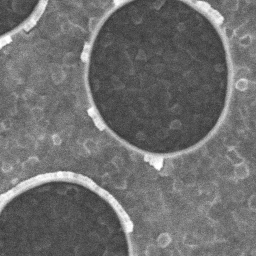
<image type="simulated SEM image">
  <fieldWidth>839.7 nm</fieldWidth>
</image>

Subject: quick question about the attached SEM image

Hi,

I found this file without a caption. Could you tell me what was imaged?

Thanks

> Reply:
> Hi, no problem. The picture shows holes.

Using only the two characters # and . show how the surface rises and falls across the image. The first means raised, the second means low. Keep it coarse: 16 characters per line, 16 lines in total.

..#####.....####
.#####.......###
######........##
######........##
#####.........##
#####.........##
######........##
######........##
#######......###
#########..#####
################
##...###########
#......#########
.......#########
........########
........########